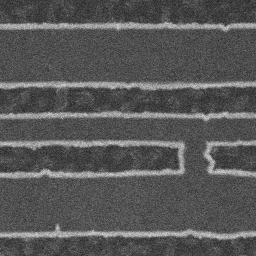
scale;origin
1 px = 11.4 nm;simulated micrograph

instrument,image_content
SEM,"one or a few lines or trenches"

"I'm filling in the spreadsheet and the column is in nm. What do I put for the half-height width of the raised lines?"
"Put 351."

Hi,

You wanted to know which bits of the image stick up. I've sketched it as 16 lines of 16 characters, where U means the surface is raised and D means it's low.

UUUUUUUUUUUUUUUU
UUUUUUUUUUUUUUUU
DDDDDDDDDDDDDDDD
DDDDDDDDDDDDDDDD
DDDDDDDDDDDDDDDD
UUUUUUUUUUUUUUUU
UUUUUUUUUUUUUUUU
DDDDDDDDDDDDDDDD
DDDDDDDDDDDDDDDD
UUUUUUUUUUUDDUUU
UUUUUUUUUUUDDUUU
DDDDDDDDDDDDDDDD
DDDDDDDDDDDDDDDD
DDDDDDDDDDDDDDDD
DDDDDDDDDDDDDDDD
UUUUUUUUUUUUUUUU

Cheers